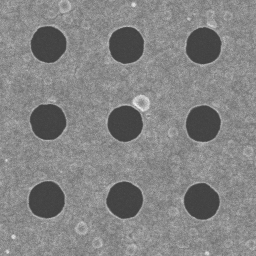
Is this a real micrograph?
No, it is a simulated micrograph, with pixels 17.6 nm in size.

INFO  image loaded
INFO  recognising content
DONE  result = a regular array of holes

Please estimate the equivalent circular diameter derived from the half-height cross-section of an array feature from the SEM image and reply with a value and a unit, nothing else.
639 nanometres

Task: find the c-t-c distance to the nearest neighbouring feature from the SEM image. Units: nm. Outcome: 1350